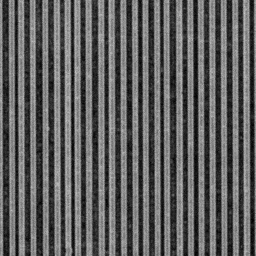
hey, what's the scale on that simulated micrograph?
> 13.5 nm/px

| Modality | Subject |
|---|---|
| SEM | parallel lines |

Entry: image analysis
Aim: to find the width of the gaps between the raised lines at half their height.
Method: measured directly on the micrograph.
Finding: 94.3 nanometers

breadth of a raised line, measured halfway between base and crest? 58.9 nanometres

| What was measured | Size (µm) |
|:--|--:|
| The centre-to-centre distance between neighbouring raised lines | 0.15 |